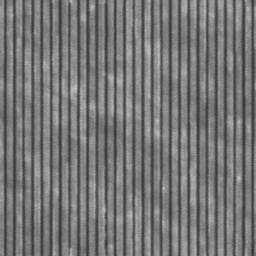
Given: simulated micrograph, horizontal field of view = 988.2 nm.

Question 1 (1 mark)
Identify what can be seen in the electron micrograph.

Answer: parallel lines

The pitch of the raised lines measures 35.5 nm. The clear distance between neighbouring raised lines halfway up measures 0.0135 µm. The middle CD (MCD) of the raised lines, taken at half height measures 23.6 nm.